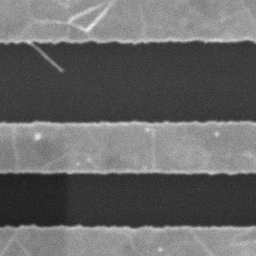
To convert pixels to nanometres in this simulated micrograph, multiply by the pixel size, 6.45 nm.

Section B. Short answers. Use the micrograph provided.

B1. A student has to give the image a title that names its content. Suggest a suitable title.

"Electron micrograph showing lines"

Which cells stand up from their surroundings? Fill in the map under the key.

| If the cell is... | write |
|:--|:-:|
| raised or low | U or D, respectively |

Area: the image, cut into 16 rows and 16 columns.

UUUUUUUUUUUUUUUU
UUUUUUUUUUUUUUUU
UUUUUUUUUUUUUUUU
DDDDDDDDDDDDDDDD
DDDDDDDDDDDDDDDD
DDDDDDDDDDDDDDDD
DDDDDDDDDDDDDDDD
DDDDDDDDDDDDDDDD
UUUUUUUUUUUUUUUU
UUUUUUUUUUUUUUUU
UUUUUUUUUUUUUUUU
DDDDDDDDDDDDDDDD
DDDDDDDDDDDDDDDD
DDDDDDDDDDDDDDDD
UUUUUUUUUUUUUUUU
UUUUUUUUUUUUUUUU